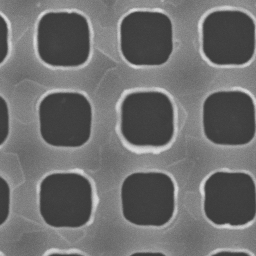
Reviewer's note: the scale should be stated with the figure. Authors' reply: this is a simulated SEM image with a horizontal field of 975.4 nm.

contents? holes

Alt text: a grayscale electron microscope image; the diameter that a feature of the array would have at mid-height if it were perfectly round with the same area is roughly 0.214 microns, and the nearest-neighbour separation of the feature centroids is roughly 306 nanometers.